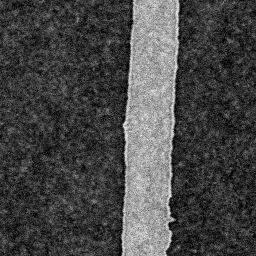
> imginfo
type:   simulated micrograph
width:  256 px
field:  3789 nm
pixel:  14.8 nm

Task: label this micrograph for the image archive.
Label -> one or a few lines or trenches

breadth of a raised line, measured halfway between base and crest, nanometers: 661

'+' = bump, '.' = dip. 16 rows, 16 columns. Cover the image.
........+++.....
........+++.....
........+++.....
........+++.....
........+++.....
........+++.....
........+++.....
........+++.....
........+++.....
........+++.....
........+++.....
........+++.....
........+++.....
........+++.....
........+++.....
........++......